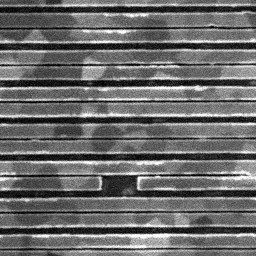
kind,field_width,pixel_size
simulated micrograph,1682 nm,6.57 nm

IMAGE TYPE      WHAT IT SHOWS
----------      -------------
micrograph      parallel lines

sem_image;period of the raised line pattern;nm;121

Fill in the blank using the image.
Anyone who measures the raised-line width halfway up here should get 82.1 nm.